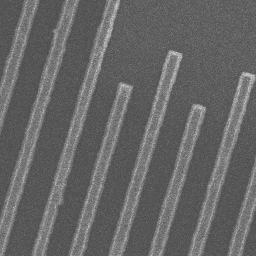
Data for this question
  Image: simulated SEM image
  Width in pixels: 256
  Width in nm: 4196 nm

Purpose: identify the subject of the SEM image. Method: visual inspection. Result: parallel lines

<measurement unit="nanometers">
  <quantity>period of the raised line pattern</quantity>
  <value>627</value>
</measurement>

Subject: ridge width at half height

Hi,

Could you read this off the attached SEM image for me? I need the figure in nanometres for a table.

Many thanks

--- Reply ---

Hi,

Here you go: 179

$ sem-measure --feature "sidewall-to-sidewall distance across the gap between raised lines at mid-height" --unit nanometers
442